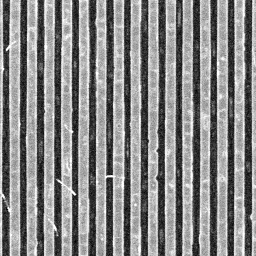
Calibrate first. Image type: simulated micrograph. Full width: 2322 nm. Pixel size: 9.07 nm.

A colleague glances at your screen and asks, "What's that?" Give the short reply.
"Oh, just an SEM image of parallel lines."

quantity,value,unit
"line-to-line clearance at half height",0.0646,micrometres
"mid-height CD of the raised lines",88.4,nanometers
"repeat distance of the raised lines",156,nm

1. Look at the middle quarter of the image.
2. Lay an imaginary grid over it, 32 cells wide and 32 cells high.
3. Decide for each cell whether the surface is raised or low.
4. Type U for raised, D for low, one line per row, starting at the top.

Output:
UUDDUUDDUUDDDUUDDUUDDUUUDDUUDDUU
UUDDUUDDUUDDDUUDDUUDDUUUDDUUDDUU
UUDDUUDDUUDDDUUDDUUDDUUUDDUUDDUU
UUDDUUDDUUDDDUUDDUUDDUUUDDUUDDUU
UUDDUUDDUUDDDUUDDUUDDUUUDDUUDDUU
UUDDUUDDUUDDDUUDDUUDDUUDDDUUDDUU
UUDDUUDDUUDDDUUDDUUDDUUDDDUUDDUU
UUDDUUDDUUDDUUUDDUUDDUUDDDUUDDUU
UUDDUUDDUUDDUUUDDUUDDUUDDDUUDDUU
UUDDUUDDUUDDUUUDDUUDDUUDDDUUDDUU
UUDDUUDDUUDDUUUDDUUDDUUDDDUUDDUU
UUDDUUDDUUDDUUUDDUUDDUUDDDUUDDUU
UUDDUUDDUUDDUUUDDUUDDUUDDUUUDDUU
UUDDUUDDUUDDUUUDDUUDDUUDDUUUDDUU
UUDDUUDDUUDDUUUDDUUDDUUDDUUUDDUU
UUDDUUDDUUDDUUUDDUUDDUUDDUUUDDUU
UUDDUUDDUUDDUUUDDUUDDUUDDUUUDDUU
UUDDUUDDUUDDUUUDDUUDDUUDDUUUDDUU
UUDDUUDDUUDDUUUDDUUDDUUDDUUUDDUU
UUDDUUDDUUDDUUUDDUUDDUUDDUUUDDUU
UUDDUUDDUUDDUUUDDUUDDUUDDUUUDDUU
UUDDUUDDUUDDUUUDDUUDDUUDDUUUDDUU
UUDDUUDDUUDDUUUDDUUDDUUDDUUUDDUU
UUDDUUDDUUDDUUUDDUUDDUUDDUUUDDUU
UUDDUUDDUUDDUUUDDUUDDUUDDUUUDDUU
UUDDUUDDUUDDUUUDDUUDDUUDDUUUDDUU
UUDDUUDDUUDDUUUDDUUDDUUDDUUUDDUU
UUDDUUDDUUUDUUUDDUUDDUUDDUUUDDUU
UUDDUUDDUUUDUUUDDUUDDUUDDUUUDDUU
UUDDUUDDUUDDUUUDDUUDDUUDDUUUDDUU
UUDDUUDDUUDDUUUDDUUDDUUDDUUUDDUU
UUDDUUDDUUDDUUUDDUUDDUUDDUUUDDUU